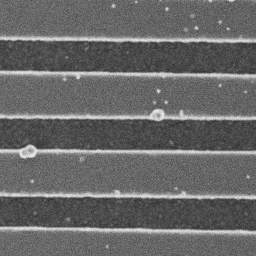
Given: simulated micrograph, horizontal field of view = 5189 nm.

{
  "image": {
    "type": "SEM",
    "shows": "lines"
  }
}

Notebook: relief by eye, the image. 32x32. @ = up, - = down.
@@@@@@@@@@@@@@@@@@@@@@@@@@@@@@@@
@@@@@@@@@@@@@@@@@@@@@@@@@@@@@@@@
@@@@@@@@@@@@@@@@@@@@@@@@@@@@@@@@
@@@@@@@@@@@@@@@@@@@@@@@@@@@@@@@@
@@@@@@@@@@@@@@@@@@@@@@@@@@@@@@@@
--------------------------------
--------------------------------
--------------------------------
--------------------------------
@@@@@@@@@@@@@@@@@@@@@@@@@@@@@@@@
@@@@@@@@@@@@@@@@@@@@@@@@@@@@@@@@
@@@@@@@@@@@@@@@@@@@@@@@@@@@@@@@@
@@@@@@@@@@@@@@@@@@@@@@@@@@@@@@@@
@@@@@@@@@@@@@@@@@@@@@@@@@@@@@@@@
@@@@@@@@@@@@@@@@@@@@@@@@@@@@@@@@
--------------------------------
--------------------------------
--------------------------------
---@----------------------------
@@@@@@@@@@@@@@@@@@@@@@@@@@@@@@@@
@@@@@@@@@@@@@@@@@@@@@@@@@@@@@@@@
@@@@@@@@@@@@@@@@@@@@@@@@@@@@@@@@
@@@@@@@@@@@@@@@@@@@@@@@@@@@@@@@@
@@@@@@@@@@@@@@@@@@@@@@@@@@@@@@@@
-----@@-@@@@@@@@@@@@@@@@@@@@@@@@
--------------------------------
--------------------------------
--------------------------------
@@@@@---------------------------
@@@@@@@@@@@@@@@@@@@@@@@@@@@@@@@@
@@@@@@@@@@@@@@@@@@@@@@@@@@@@@@@@
@@@@@@@@@@@@@@@@@@@@@@@@@@@@@@@@